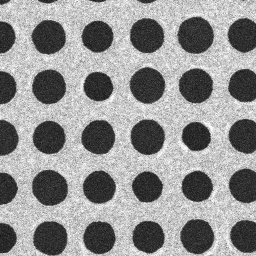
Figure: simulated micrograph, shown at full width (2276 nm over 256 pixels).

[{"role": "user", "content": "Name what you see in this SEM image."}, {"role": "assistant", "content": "a regular array of holes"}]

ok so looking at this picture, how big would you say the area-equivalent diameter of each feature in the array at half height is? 305 nanometers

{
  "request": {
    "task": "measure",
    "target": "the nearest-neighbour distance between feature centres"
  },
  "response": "430 nm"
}